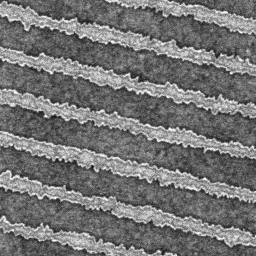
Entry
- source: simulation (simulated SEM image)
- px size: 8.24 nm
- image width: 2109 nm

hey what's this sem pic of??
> parallel lines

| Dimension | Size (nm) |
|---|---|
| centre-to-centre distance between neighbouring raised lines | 343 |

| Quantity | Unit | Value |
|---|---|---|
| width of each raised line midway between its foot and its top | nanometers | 94.2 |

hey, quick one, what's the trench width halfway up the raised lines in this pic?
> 245 nm